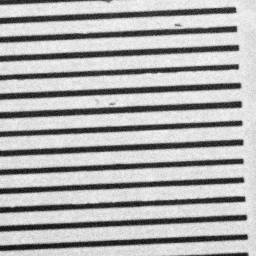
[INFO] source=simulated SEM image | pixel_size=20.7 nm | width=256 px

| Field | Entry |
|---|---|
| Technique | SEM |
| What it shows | parallel lines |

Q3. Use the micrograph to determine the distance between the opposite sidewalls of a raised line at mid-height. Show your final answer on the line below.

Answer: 258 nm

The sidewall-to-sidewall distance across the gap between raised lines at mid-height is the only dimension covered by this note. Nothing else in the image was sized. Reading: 134 nm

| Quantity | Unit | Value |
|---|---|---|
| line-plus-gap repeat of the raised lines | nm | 392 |